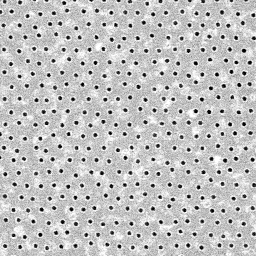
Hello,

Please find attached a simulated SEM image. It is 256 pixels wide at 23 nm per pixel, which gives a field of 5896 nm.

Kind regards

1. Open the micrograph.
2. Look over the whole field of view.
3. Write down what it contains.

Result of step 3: a regular array of holes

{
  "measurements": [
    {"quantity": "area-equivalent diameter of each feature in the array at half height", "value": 4.79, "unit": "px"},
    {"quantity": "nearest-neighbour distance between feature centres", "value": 271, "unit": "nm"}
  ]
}